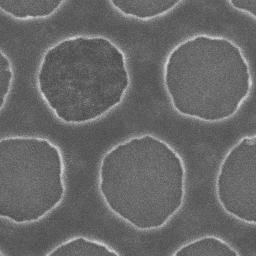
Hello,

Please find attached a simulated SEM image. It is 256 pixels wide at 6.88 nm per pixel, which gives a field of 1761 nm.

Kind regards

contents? holes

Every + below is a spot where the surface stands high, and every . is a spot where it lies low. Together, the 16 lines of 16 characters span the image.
...++++....++++.
++++++++++++++++
++++..++++++..++
+++.....+++....+
.++.....++......
.++.....+++.....
+++....++++....+
++++.+++++++++++
++++++++++++++++
....+++....+++..
....++.....+++..
....++.....+++..
....+++....+++..
...+++++...++++.
++++++++++++++++
++++...++++...++